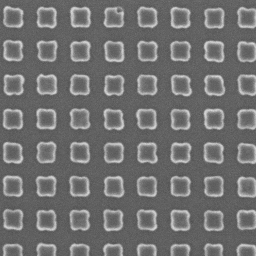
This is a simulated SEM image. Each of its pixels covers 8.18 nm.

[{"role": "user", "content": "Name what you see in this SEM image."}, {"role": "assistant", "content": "a regular array of raised bodies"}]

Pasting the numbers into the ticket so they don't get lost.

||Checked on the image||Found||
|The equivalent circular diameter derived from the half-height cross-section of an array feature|169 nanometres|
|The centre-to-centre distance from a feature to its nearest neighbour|271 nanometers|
